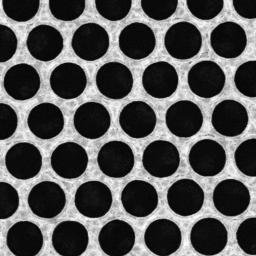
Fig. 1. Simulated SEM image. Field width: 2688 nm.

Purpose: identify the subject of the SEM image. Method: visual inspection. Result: a regular array of holes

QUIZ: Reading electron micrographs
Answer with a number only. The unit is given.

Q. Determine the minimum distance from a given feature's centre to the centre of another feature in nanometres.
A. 474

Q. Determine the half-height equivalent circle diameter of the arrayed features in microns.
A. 0.391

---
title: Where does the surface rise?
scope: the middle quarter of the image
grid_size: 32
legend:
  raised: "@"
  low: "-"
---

----@@@@@------@@@@@@------@@@@@
-----@@@@-------@@@@--------@@@@
-----@@@---------@@@--------@@@-
------@@---------@@@---------@@-
------@@---------@@----------@@-
------@@---------@@@--------@@@-
-----@@@@--------@@@--------@@@@
----@@@@@@------@@@@@------@@@@@
---@@@@@@@@----@@@@@@@@@-@@@@@@@
@@@@@@--@@@@@@@@@---@@@@@@@@----
@@@@------@@@@@------@@@@@@-----
@@@--------@@@--------@@@@------
@@@--------@@@---------@@-------
@@----------@@---------@@-------
@@----------@@---------@@-------
@@@---------@@---------@@@------
@@@--------@@@@-------@@@@------
@@@@------@@@@@@------@@@@@-----
@@@@@@---@@@@@@@@@-@@@@@@@@@@@@@
@-@@@@@@@@@----@@@@@@@----@@@@@@
----@@@@@@------@@@@@-------@@@@
-----@@@@--------@@@--------@@@-
------@@---------@@@---------@@-
------@@----------@----------@@-
------@@----------@----------@@-
------@@@--------@@@---------@@@
-----@@@@--------@@@--------@@@@
-----@@@@@------@@@@@------@@@@@
---@@@@@@@@@@-@@@@@@@@@@@@@@@@@@
@@@@@@---@@@@@@@-----@@@@@@@----
@@@@-------@@@@-------@@@@@-----
@@@---------@@@--------@@@------